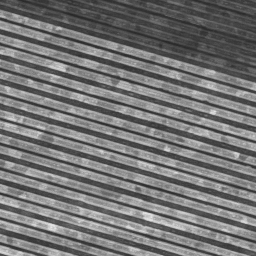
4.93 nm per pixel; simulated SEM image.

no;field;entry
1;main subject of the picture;parallel lines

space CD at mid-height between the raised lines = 28.4 nm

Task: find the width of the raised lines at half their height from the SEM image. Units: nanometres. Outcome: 27.8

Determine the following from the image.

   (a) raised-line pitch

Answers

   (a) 0.0589 micrometres